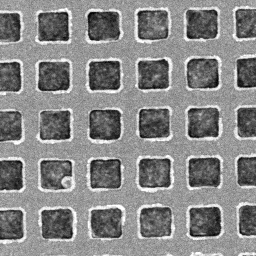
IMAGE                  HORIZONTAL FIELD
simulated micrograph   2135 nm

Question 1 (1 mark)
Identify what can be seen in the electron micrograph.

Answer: a regular array of holes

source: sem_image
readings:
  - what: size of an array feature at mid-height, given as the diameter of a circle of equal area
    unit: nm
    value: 287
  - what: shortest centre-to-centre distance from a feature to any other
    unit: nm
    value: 410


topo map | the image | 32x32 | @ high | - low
@@@@@@@@@@@@@@@@@@@@@@@@@@@@@@@@
@@@@@---@@@---@@@----@@----@@---
---@@----@@----@@----@@----@@---
---@@----@@----@@----@@----@@---
---@@----@@----@@----@@----@@@--
@@@@@@@@@@@@@@@@@@@@@@@@@@@@@@@@
@@@@@@@@@@@@@@@@@@@@@@@@@@@@@@@@
@@@@@@@@@@@@@@@@@@---@@@---@@@--
---@@----@@----@@----@@----@@@--
---@@----@@----@@----@@----@@@--
---@@----@@----@@----@@----@@@--
--@@@@@@@@@@@@@@@@@@@@@@@@@@@@@@
@@@@@@@@@@@@@@@@@@@@@@@@@@@@@@@@
@@@@@@@@@@@@@@@@@@@@@@@@---@@@--
---@@----@@----@@----@@----@@@--
---@@----@@----@@----@@-----@@--
---@@----@@----@@----@@@---@@@--
--@@@---@@@@--@@@@@@@@@@@@@@@@@@
@@@@@@@@@@@@@@@@@@@@@@@@@@@@@@@@
@@@@@@@@@@@@@@@@@@@@@@@@@@@@@@@@
---@@----@@----@@----@@@---@@@--
---@@----@@----@@----@@-----@@--
---@@----@@----@@----@@@----@@--
---@@----@@@---@@@---@@@@@@@@@@@
@@@@@@@@@@@@@@@@@@@@@@@@@@@@@@@@
@@@@@@@@@@@@@@@@@@@@@@@@@@@@@@@@
---@@----@@----@@@---@@@----@@--
---@@----@@----@@-----@@----@@--
---@@----@@----@@----@@@----@@--
---@@----@@@---@@@---@@@---@@@@-
@@@@@@@@@@@@@@@@@@@@@@@@@@@@@@@@
@@@@@@@@@@@@@@@@@@@@@@@@@@@@@@@@